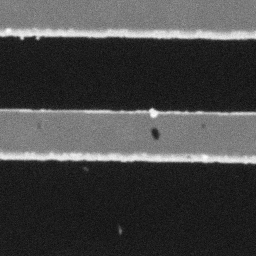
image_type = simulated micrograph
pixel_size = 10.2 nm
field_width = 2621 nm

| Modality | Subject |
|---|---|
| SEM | lines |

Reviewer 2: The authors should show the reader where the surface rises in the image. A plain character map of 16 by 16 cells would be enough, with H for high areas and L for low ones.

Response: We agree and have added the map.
HHHHHHHHHHHHHHHH
HHHHHHHHHHHHHHHH
LLLLLLLLLLLLLLLL
LLLLLLLLLLLLLLLL
LLLLLLLLLLLLLLLL
LLLLLLLLLLLLLLLL
LLLLLLLLLLLLLLLL
HHHHHHHHHHHHHHHH
HHHHHHHHHHHHHHHH
HHHHHHHHHHHHHHHH
LLLLLLLLLLLLLLLL
LLLLLLLLLLLLLLLL
LLLLLLLLLLLLLLLL
LLLLLLLLLLLLLLLL
LLLLLLLLLLLLLLLL
LLLLLLLLLLLLLLLL